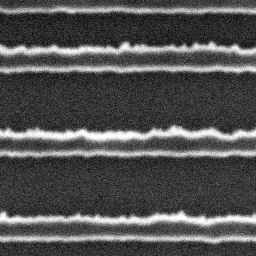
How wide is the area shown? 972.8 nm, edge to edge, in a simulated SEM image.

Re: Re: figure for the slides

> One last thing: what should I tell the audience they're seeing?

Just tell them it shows lines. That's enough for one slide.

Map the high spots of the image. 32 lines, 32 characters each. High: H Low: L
HHHHHHHHHHHHHHHHHHHHHHHHHHHHHHHH
HHHLLLLLLLLLLLLLLHHLHHLHHHLLLLLH
LLLLLLLLLLLLLLLLLLLLLLLLLLLLLLLL
LLLLLLLLLLLLLLLLLLLLLLLLLLLLLLLL
LLLLLLLLLLLLLLLLLLLLLLLLLLLLLLLL
LLLLLLLLLLLLLLLLLLLLLLLLLLLLLLLL
HHHHHHHHHHHHHHHHHHHHHHHHHHHHHHHH
HHHHHHHHHHHHHHHHHHHHHHHHHHHHHHHH
HHHHHHHHHHHHHHHHHHHHHHHHHHHHHHHH
LLLLLLLLLLLLLLLLLLLLLLLLLLLLLLLL
LLLLLLLLLLLLLLLLLLLLLLLLLLLLLLLL
LLLLLLLLLLLLLLLLLLLLLLLLLLLLLLLL
LLLLLLLLLLLLLLLLLLLLLLLLLLLLLLLL
LLLLLLLLLLLLLLLLLLLLLLLLLLLLLLLL
LLLLLLLLLLLLLLLLLLLLLLLLLLLLLLLL
LLLLLLLLLLLLLLLLLLLLLLLLLLLLLLLL
LLLLLLLLLLLLLLLLLLLLLLLLLLLLLLLL
HHHHHHHHHHHHHHHHHHHHHHHHHHHHHHHH
HHHHHHHHHHHHHHHHHHHHHHHHHHHHHHHH
LLLLLLLLLLLLLLLLLLLLLLLLLLLLLLLL
LLLLLLLLLLLLLLLLLLLLLLLLLLLLLLLL
LLLLLLLLLLLLLLLLLLLLLLLLLLLLLLLL
LLLLLLLLLLLLLLLLLLLLLLLLLLLLLLLL
LLLLLLLLLLLLLLLLLLLLLLLLLLLLLLLL
LLLLLLLLLLLLLLLLLLLLLLLLLLLLLLLL
LLLLLLLLLLLLLLLLLLLLLLLLLLLLLLLL
LLLLLLLLLLLLLLLLLLLLLLLLLLLLLLLL
HHHHHHHHHHHHHHHHHHHHHHHHHLHHHHHH
HHHHHHHHHHHHHHHHHHHHHHHHHHHHHHHH
HHHHHHHHHHHHHHHHHHHHHHHHHHHHHHHH
LLLLLLLLLLLLLLLLLLLLLLLLLLLLLLLL
LLLLLLLLLLLLLLLLLLLLLLLLLLLLLLLL